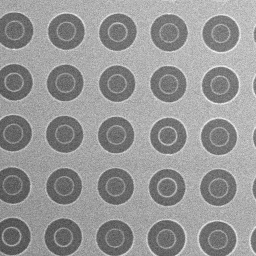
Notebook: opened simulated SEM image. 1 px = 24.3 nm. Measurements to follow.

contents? an array of small figures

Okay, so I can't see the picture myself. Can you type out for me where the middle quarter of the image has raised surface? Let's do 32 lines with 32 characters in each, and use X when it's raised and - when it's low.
--XXXXXXXXXX---XXXXXXXXXX--XXXXX
----XXXXXX-------XXXXXX------XXX
X----XXXX--------XXXXX--------XX
XX---XXXX---XXX---XXXX--XXXX--XX
XXX--XXXX--XXXX---XXX---XXXX---X
XXX--XXXX--XXXX---XXX---XXXX---X
XX---XXXX---XXX---XXXX--XXXX---X
----XXXXX--------XXXXX--------XX
---XXXXXXX------XXXXXXX------XXX
XXXXXXXXXXXX--XXXXXXXXXXX--XXXXX
XXXXXXXXXXXXXXXXXXXXXXXXXXXXXXXX
XXXXXXXXXXXXXXXXXXXXXXXXXXXXXXXX
XXXXXXXXXXXXXXXXXXXXXXXXXXXXXXXX
---XXXXXXXX----XXXXXXXXXX---XXXX
----XXXXXX------XXXXXXX------XXX
X---XXXXX--------XXXXX--------XX
XX---XXXX--XXXX---XXXX--XXXX---X
XX---XXX---XXXX---XXX---XXXX---X
XX---XXX---XXXX---XXX---XXXX---X
X----XXXX---XXX--XXXXX--XXXX--XX
----XXXXX--------XXXXX--------XX
---XXXXXXX------XXXXXXX------XXX
XXXXXXXXXXXXXXXXXXXXXXXXX--XXXXX
XXXXXXXXXXXXXXXXXXXXXXXXXXXXXXXX
XXXXXXXXXXXXXXXXXXXXXXXXXXXXXXXX
XXXXXXXXXXXXXXXXXXXXXXXXXXXXXXXX
--XXXXXXXXX----XXXXXXXXX----XXXX
----XXXXX-------XXXXXX-------XXX
X---XXXXX---XX---XXXXX--------XX
XX---XXX---XXXX--XXXX---XXXX--XX
XX---XXX---XXXX---XXX---XXXX---X
XX--XXXX---XXXX---XXX---XXXX---X